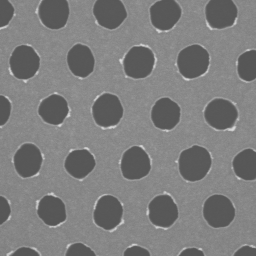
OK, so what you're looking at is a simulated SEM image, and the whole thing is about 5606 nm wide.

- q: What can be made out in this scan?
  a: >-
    a regular array of holes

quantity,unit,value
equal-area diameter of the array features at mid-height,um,0.684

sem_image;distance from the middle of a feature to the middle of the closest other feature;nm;1200